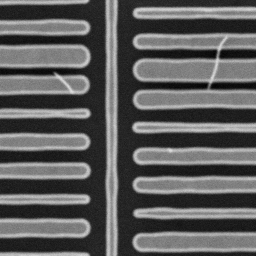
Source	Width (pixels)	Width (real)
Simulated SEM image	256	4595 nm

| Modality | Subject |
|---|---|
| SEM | groups of lines, slits or small figures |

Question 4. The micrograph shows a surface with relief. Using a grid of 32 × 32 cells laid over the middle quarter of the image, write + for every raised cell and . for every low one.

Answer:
+++++......++.....++++++++++++++
...........++.....++++++++++++++
...........++.....++++++++++++++
+++++......++.....++++++++++++++
++++++.....++...................
++++++.....++...................
++++++.....++...................
...........++.....++++++++++++++
...........++.....++++++++++++++
...........++.....++++++++++++++
...........++.....++++++++++++++
...........++...................
++++++.....++...................
...........++...................
...........++...................
...........++.....++++++++++++++
...........++.....++++++++++++++
...........++...................
++++++.....++...................
++++++.....++...................
++++++.....++...................
...........++......+++++++++++++
...........++.....++++++++++++++
...........++.....++++++++++++++
...........++......+++++++++++++
++++++.....++...................
++++++.....++...................
++++++.....++...................
...........++...................
...........++.....++++++++++++++
...........++.....++++++++++++++
...........++.....++++++++++++++